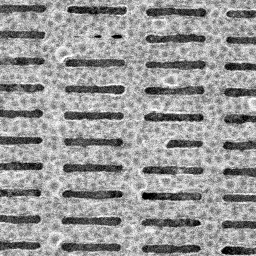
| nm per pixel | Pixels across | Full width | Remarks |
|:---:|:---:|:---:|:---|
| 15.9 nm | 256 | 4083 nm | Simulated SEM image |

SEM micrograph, a regular array of holes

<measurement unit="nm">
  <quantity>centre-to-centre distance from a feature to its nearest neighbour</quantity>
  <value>419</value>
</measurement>